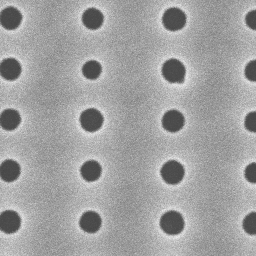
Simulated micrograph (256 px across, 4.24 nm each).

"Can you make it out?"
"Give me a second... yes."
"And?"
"a regular array of holes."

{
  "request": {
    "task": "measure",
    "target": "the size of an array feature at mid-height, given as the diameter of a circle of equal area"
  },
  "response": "102 nm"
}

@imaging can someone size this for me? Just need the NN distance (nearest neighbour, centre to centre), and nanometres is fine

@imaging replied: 214